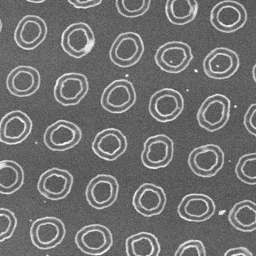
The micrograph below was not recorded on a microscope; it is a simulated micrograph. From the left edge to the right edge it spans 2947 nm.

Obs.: a regular array of ring-shaped raised bodies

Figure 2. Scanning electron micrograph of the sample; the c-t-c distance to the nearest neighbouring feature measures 549 nm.